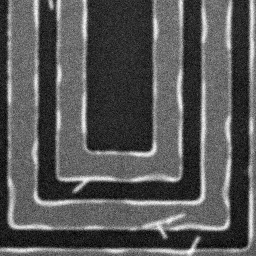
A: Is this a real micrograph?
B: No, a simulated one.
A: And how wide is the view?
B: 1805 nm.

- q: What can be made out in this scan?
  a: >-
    groups of lines, slits or small figures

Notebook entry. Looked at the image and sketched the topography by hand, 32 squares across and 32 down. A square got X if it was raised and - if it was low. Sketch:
-XXX---XXXX--------XXXX--XXXX--X
-XXX---XXXX--------XXXX--XXXX---
-XXXX--XXXX--------XXXX--XXXX---
-XXXX--XXXX--------XXXX---XXX--X
-XXXX--XXXX--------XXXX--XXX---X
-XXXX--XXXX--------XXXX--XXXX---
-XXXX--XXXX--------XXXX--XXXX---
-XXXX--XXXX--------XXXX--XXXX--X
-XXXX--XXXX--------XXXX--XXXX--X
-XXXX--XXXX--------XXXX--XXXX--X
-XXX---XXXX--------XXX---XXXX--X
-XXXX--XXXX--------XXX---XXXX--X
-XXXX--XXXX--------XXXX--XXXX--X
-XXXX--XXX---------XXXX--XXXX--X
-XXXX--XXX---------XXXX--XXXX--X
-XXXX--XXX---------XXXX--XXX---X
-XXXX--XXXX--------XXXX--XXX---X
-XXXX--XXXX--------XXXX--XXXX--X
-XXX---XXXX--------XXXX--XXXX--X
-XXX---XXXXXXXXXXXXXXXX--XXXX--X
-XXXX--XXXXXXXXXXXXXXXX--XXXX--X
-XXXX--XXXXXXXXXXXXXXXX--XXX---X
-XXXX----------XX--------XXX---X
-XXX---------------------XXX---X
--XXX--------------------XXX---X
-XXXXXXXXXXXXXXXXXXXXXXXXXXX---X
-XXXXXXXXXXXXXXXXXXXXXXXXXXXX--X
-XXXXXXXXXXXXXXXXXXXXXXXXXXXX--X
------XXXXX---XXXXXXXX----XX---X
-------------------------------X
-------------------------------X
XXXXXXXXXXXXXXXXXXXXXX-XXXXXXXXX